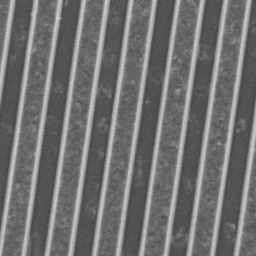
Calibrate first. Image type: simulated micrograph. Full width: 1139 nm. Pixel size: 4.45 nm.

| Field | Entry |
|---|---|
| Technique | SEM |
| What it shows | parallel lines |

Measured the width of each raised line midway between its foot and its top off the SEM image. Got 0.11 µm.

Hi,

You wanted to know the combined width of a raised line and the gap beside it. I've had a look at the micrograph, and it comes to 208 nanometres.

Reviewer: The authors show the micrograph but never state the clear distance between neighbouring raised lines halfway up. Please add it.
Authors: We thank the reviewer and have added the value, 0.0981 µm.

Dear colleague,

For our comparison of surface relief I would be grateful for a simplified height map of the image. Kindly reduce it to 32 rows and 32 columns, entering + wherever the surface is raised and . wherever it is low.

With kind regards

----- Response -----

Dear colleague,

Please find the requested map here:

++..+++...+++...+++...+++...+++.
+...+++...+++...+++...+++...+++.
+...+++...+++...+++...+++...+++.
+...+++...+++...+++...+++...+++.
+...+++...+++...+++...+++...+++.
+...+++...+++...+++..++++..+++..
+...+++..++++..+++...+++...+++..
+..+++...+++...+++...+++...+++..
...+++...+++...+++...+++...+++..
...+++...+++...+++...+++...+++..
...+++...+++...+++...+++...+++..
...+++...+++...+++...+++..++++..
...+++...+++...+++..++++..+++...
...+++..++++..++++..+++...+++...
..+++...+++...+++...+++...+++...
..+++...+++...+++...+++...+++...
..+++...+++...+++...+++...+++...
..+++...+++...+++...+++...+++...
..+++...+++...+++...+++..++++..+
..+++...+++...+++..++++..+++...+
.++++..++++..+++...+++...+++...+
.+++...+++...+++...+++...+++...+
.+++...+++...+++...+++...+++...+
.+++...+++...+++...+++...+++...+
.+++...+++...+++...+++...+++...+
.+++...+++...+++..++++...+++..++
.+++...+++..++++..++++..+++...++
++++..++++..+++...+++...+++...++
++++..+++...+++...+++...+++...++
+++...+++...+++...+++...+++...++
+++...+++...+++...+++...+++...++
+++...+++...+++...+++...+++...++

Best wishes